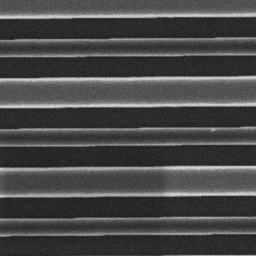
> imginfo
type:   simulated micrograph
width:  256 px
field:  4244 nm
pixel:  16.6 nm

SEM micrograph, lines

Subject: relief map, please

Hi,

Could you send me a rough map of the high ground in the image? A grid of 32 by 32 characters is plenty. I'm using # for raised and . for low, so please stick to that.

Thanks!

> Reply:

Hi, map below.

################################
################################
................................
................................
................................
################################
################################
................................
................................
................................
################################
################################
################################
................................
................................
................................
################################
################################
................................
................................
................................
################################
################################
################################
#########.#.....................
................................
................................
################################
################################
#...............................
................................
................................